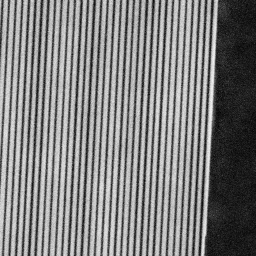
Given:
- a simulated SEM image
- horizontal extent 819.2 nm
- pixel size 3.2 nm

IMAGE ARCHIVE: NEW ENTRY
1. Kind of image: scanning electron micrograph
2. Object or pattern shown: parallel lines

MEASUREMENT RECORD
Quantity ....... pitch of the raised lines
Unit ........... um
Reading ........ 0.0209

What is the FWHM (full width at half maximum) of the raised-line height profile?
12 nm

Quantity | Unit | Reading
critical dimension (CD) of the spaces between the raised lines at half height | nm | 8.8